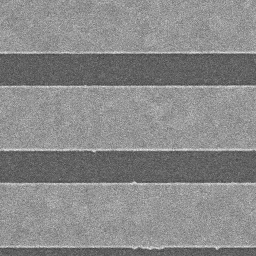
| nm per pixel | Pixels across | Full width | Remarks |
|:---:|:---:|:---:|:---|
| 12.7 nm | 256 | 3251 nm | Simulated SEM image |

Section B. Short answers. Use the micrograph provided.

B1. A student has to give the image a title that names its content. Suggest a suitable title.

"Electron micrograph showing one or a few lines or trenches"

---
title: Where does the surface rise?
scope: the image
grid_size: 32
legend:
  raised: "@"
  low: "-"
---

@@@@@@@@@@@@@@@@@@@@@@@@@@@@@@@@
@@@@@@@@@@@@@@@@@@@@@@@@@@@@@@@@
@@@@@@@@@@@@@@@@@@@@@@@@@@@@@@@@
@@@@@@@@@@@@@@@@@@@@@@@@@@@@@@@@
@@@@@@@@@@@@@@@@@@@@@@@@@@@@@@@@
@@@@@@@@@@@@@@@@@@@@@@@@@@@@@@@@
@@@@@@@@@@@@@@@@@@@@@@@@@@@@@@@@
--------------------------------
--------------------------------
--------------------------------
--------------------------------
@@@@@@@@@@@@@@@@@@@@@@@@@@@@@@@@
@@@@@@@@@@@@@@@@@@@@@@@@@@@@@@@@
@@@@@@@@@@@@@@@@@@@@@@@@@@@@@@@@
@@@@@@@@@@@@@@@@@@@@@@@@@@@@@@@@
@@@@@@@@@@@@@@@@@@@@@@@@@@@@@@@@
@@@@@@@@@@@@@@@@@@@@@@@@@@@@@@@@
@@@@@@@@@@@@@@@@@@@@@@@@@@@@@@@@
@@@@@@@@@@@@@@@@@@@@@@@@@@@@@@@@
--------------------------------
--------------------------------
--------------------------------
--------------------------------
@@@@@@@@@@@@@@@@@@@@@@@@@@@@@@@@
@@@@@@@@@@@@@@@@@@@@@@@@@@@@@@@@
@@@@@@@@@@@@@@@@@@@@@@@@@@@@@@@@
@@@@@@@@@@@@@@@@@@@@@@@@@@@@@@@@
@@@@@@@@@@@@@@@@@@@@@@@@@@@@@@@@
@@@@@@@@@@@@@@@@@@@@@@@@@@@@@@@@
@@@@@@@@@@@@@@@@@@@@@@@@@@@@@@@@
@@@@@@@@@@@@@@@@@@@@@@@@@@@@@@@@
--------------------------------